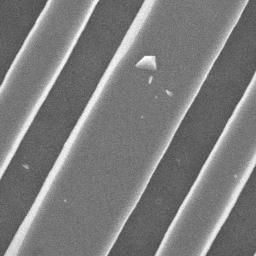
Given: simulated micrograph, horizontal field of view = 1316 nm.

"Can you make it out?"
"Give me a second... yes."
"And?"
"lines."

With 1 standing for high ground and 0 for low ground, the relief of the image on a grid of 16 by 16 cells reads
0001110001111110
0011100011111110
0011100011111100
0111000111111100
0111000111111000
1110001111110001
1110001111110001
1100011111100011
1000111111100011
1000111111000111
0001111111000111
0001111110001110
0011111110001110
0011111100011100
0111111100111100
0111111000111000